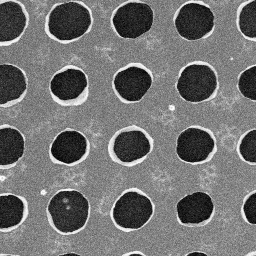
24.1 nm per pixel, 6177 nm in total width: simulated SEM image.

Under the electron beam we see a regular array of holes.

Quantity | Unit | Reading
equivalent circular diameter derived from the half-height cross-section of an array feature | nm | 896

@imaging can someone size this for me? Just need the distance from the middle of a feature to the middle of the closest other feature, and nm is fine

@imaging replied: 1490